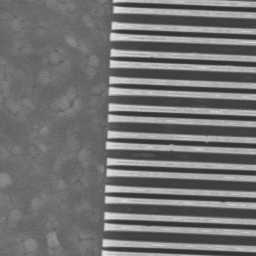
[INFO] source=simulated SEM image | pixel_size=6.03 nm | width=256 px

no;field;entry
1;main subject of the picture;parallel lines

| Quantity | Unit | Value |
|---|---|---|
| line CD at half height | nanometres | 39.9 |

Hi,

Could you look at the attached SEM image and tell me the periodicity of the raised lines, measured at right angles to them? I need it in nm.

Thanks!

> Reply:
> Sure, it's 82.7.